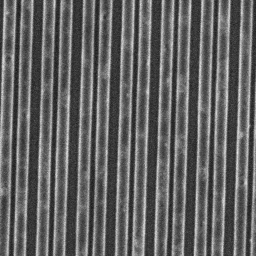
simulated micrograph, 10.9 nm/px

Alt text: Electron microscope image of parallel lines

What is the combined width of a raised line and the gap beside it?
217 nanometers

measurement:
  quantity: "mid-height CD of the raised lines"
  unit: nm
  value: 120